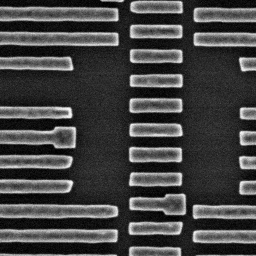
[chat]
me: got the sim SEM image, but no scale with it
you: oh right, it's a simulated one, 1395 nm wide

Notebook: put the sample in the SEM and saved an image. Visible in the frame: wiring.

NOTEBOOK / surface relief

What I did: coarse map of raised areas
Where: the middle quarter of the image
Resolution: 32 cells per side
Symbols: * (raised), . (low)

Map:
**..............................
................................
................................
.................************...
.................************...
...................**********...
................................
................................
................................
.................************...
.................************...
**...............************...
**..............................
................................
................................
.................************...
***..............************...
***..............************...
***.............................
***.............................
***.............................
.................************...
.................************...
**...............************...
**..............................
*...............................
................................
.................************...
.................************...
**...............************...
**..............................
*...............................